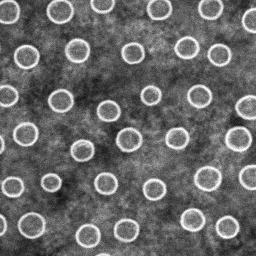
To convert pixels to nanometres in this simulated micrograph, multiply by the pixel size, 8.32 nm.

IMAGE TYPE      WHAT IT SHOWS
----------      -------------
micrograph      a regular array of raised bodies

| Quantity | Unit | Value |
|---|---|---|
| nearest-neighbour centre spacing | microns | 0.349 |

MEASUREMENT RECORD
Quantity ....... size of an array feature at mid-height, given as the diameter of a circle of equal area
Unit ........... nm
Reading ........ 176